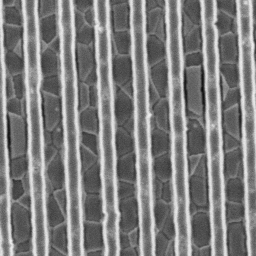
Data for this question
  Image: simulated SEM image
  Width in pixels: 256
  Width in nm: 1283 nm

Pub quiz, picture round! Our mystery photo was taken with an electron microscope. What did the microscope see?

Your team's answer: parallel lines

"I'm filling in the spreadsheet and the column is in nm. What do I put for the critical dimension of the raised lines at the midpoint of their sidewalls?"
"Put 65.7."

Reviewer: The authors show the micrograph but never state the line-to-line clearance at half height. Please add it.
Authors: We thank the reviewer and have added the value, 22.6 pixels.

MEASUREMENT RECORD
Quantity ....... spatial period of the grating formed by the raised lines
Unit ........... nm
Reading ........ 179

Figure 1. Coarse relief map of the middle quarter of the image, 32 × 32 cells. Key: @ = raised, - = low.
@@@------@@@-----@@@------@@@@--
@@@-----@@@@-----@@@@-----@@@@--
@@@------@@@-----@@@@-----@@@---
@@@------@@@------@@@-----@@@@--
@@@------@@@------@@@------@@@-@
@@@------@@@------@@@------@@@-@
@@@------@@@------@@@------@@@-@
@@@------@@@------@@@------@@@-@
@@@------@@@------@@@------@@@-@
@@@------@@@------@@@------@@@--
@@@------@@@------@@@------@@@--
@@@------@@@------@@@------@@@--
@@@------@@@------@@@@-----@@@--
@@@------@@@------@@@------@@@--
@@@------@@@------@@@------@@@--
@@@------@@@------@@@------@@@--
@@@------@@@------@@@------@@@--
@@@@-----@@@------@@@------@@@--
@@@------@@@------@@@------@@@--
@@@------@@@------@@@------@@@--
@@@------@@@------@@@@-----@@@--
@@@------@@@@-----@@@------@@@--
@@@@-----@@@@-----@@@------@@@--
@@@@-----@@@@-----@@@@-----@@@--
@@@@-----@@@@-----@@@@-----@@@@-
@@@@------@@@-----@@@@-----@@@@-
@@@@------@@@-----@@@@-----@@@--
@@@@-----@@@@------@@@-----@@@@-
-@@@-----@@@@------@@@-----@@@@-
-@@@------@@@------@@@-----@@@@-
-@@@------@@@------@@@-----@@@@-
-@@@------@@@------@@@------@@@-